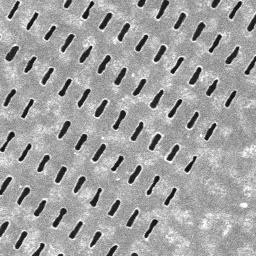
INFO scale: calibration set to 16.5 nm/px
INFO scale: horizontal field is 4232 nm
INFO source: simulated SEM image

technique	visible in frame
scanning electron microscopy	a regular array of holes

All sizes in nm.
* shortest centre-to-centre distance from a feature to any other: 345